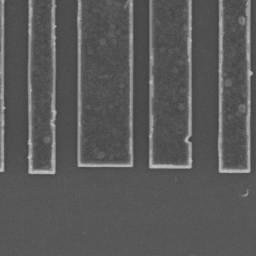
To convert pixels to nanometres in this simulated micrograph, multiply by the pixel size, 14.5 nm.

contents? one or a few lines or trenches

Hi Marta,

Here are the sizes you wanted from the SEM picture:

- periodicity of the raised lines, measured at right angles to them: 931 nanometres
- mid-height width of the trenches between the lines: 359 nm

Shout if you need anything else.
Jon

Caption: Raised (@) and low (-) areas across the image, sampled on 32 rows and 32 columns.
----@@@---@@@@@@@--@@@@@----@@@-
----@@@---@@@@@@---@@@@@----@@@-
----@@@---@@@@@@---@@@@@---@@@@-
----@@@---@@@@@@@--@@@@@---@@@@-
----@@@---@@@@@@@--@@@@@----@@@-
----@@@---@@@@@@---@@@@@----@@@-
----@@@---@@@@@@---@@@@@----@@@-
----@@@---@@@@@@---@@@@@---@@@@-
----@@@---@@@@@@---@@@@@---@@@@-
----@@@---@@@@@@---@@@@@---@@@@-
----@@@---@@@@@@---@@@@@---@@@@-
----@@@---@@@@@@---@@@@@---@@@@-
----@@@---@@@@@@---@@@@@---@@@@-
----@@@---@@@@@@---@@@@@---@@@@-
----@@@---@@@@@@---@@@@@---@@@@-
----@@@---@@@@@@---@@@@@---@@@@-
----@@@---@@@@@@---@@@@@---@@@@-
----@@@---@@@@@@---@@@@@---@@@@-
----@@@---@@@@@@---@@@@@---@@@@-
----@@@---@@@@@@---@@@@@---@@@@-
----@@@---@@@@@@---@@@@@---@@@@-
----@@----------------------@@@-
--------------------------------
--------------------------------
--------------------------------
--------------------------------
--------------------------------
--------------------------------
--------------------------------
--------------------------------
--------------------------------
--------------------------------